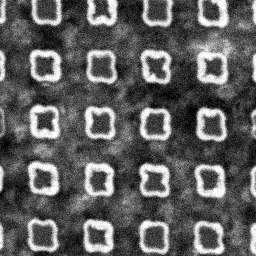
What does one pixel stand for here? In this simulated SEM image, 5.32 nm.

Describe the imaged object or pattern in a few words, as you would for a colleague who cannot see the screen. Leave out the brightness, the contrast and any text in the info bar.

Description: a regular array of raised bodies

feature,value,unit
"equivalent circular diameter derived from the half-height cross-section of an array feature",159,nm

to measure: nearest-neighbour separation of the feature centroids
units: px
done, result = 55.3